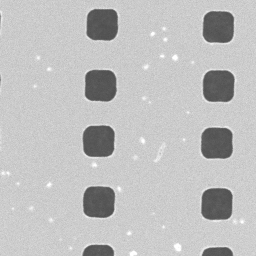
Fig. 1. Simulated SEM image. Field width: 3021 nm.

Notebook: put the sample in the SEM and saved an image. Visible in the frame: a regular array of holes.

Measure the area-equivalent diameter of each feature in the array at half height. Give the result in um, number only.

0.407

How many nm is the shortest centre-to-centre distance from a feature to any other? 686